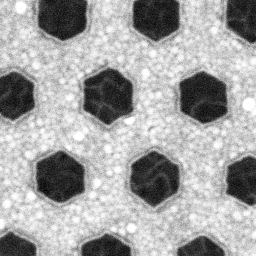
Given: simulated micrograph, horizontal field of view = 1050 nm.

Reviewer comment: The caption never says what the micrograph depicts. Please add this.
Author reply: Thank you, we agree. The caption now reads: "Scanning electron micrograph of raised bodies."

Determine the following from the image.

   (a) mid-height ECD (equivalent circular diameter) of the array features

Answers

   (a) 220 nm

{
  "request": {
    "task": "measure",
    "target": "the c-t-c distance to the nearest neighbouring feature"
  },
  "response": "387 nanometers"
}